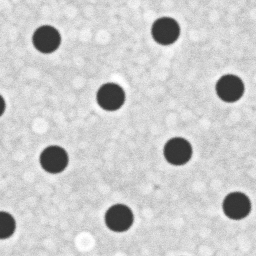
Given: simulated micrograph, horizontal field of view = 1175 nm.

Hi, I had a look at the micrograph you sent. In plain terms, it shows a regular array of holes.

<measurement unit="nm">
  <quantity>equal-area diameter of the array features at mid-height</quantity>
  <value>135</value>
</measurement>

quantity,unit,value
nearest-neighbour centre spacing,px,84.3